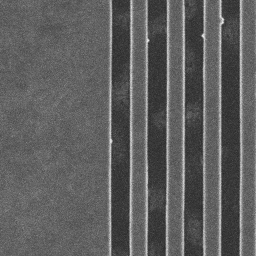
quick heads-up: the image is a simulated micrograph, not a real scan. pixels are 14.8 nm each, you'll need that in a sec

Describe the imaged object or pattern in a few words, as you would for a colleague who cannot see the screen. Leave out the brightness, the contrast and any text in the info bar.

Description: parallel lines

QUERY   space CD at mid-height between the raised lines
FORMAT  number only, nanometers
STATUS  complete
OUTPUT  292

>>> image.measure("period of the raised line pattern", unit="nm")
541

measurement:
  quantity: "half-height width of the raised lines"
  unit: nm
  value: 252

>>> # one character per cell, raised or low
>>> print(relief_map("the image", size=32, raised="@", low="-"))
@@@@@@@@@@@@@@--@@---@@---@@--@@
@@@@@@@@@@@@@@--@@---@@---@@--@@
@@@@@@@@@@@@@@--@@---@@---@@--@@
@@@@@@@@@@@@@@--@@---@@---@---@@
@@@@@@@@@@@@@@--@@---@@--@@---@@
@@@@@@@@@@@@@@--@@@--@@---@---@@
@@@@@@@@@@@@@@--@@---@@--@@---@@
@@@@@@@@@@@@@@--@@---@@--@@---@@
@@@@@@@@@@@@@@--@@---@@--@@---@@
@@@@@@@@@@@@@@--@@---@@--@@---@@
@@@@@@@@@@@@@@--@@---@@--@@---@@
@@@@@@@@@@@@@@--@@---@@---@---@@
@@@@@@@@@@@@@@--@@---@@---@---@@
@@@@@@@@@@@@@@--@@---@@---@---@@
@@@@@@@@@@@@@@--@@---@@---@---@@
@@@@@@@@@@@@@@--@@---@@---@---@@
@@@@@@@@@@@@@@--@@---@@--@@---@@
@@@@@@@@@@@@@@--@@---@@--@@---@@
@@@@@@@@@@@@@@--@@---@@--@@---@@
@@@@@@@@@@@@@@--@@---@@---@---@@
@@@@@@@@@@@@@@--@@---@@--@@---@@
@@@@@@@@@@@@@@--@@---@@--@@@--@@
@@@@@@@@@@@@@@--@@---@@---@@--@@
@@@@@@@@@@@@@@--@@---@@---@@--@@
@@@@@@@@@@@@@@--@@---@@---@@--@@
@@@@@@@@@@@@@@--@@---@@---@@--@@
@@@@@@@@@@@@@@--@@---@@---@@--@@
@@@@@@@@@@@@@@--@@---@@---@@--@@
@@@@@@@@@@@@@@--@@---@@---@---@@
@@@@@@@@@@@@@@--@@---@@---@---@@
@@@@@@@@@@@@@@--@@---@@---@---@@
@@@@@@@@@@@@@@--@@---@@---@---@@